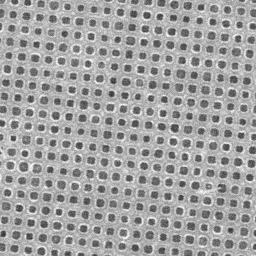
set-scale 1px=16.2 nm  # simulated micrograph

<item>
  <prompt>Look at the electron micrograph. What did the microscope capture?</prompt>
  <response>a regular array of holes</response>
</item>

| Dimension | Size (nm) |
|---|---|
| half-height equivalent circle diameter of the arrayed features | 144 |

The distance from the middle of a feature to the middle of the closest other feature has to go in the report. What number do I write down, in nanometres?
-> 213